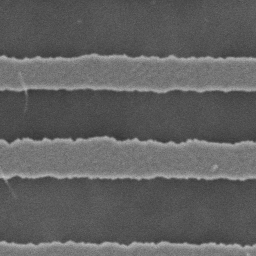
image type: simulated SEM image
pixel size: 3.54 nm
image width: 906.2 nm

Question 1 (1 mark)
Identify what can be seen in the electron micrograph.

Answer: lines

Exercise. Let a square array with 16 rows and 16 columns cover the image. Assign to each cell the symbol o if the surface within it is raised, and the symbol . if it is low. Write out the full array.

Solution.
................
................
................
.....ooo........
oooooooooooooooo
oooooooooooooooo
................
................
................
oooooooooooooooo
oooooooooooooooo
................
................
................
................
oooooooooooooooo